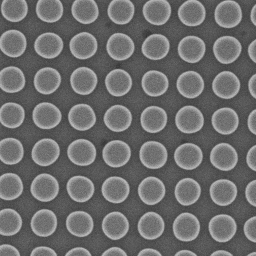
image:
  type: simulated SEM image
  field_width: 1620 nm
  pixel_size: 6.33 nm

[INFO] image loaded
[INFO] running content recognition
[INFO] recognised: an array of small figures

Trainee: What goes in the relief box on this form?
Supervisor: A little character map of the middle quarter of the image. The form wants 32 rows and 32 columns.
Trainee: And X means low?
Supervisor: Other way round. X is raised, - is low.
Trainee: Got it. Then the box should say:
--------------------------------
---XXXX------X------------------
--XXXXXX---XXXXX----XXXXX-----XX
--XXXXXX---XXXXXX---XXXXXX---XXX
--XXXXXX--XXXXXXX---XXXXXX--XXXX
--XXXXXX---XXXXXX---XXXXXX--XXXX
---XXXX----XXXXX----XXXXXX---XXX
----XX------XXX------XXX-----XXX
-------------------------------X
--------------------------------
---XXX------XX-----------------X
--XXXXX----XXXXX----XXXXX----XXX
-XXXXXXX--XXXXXXX--XXXXXXX--XXXX
-XXXXXXX--XXXXXXX--XXXXXXX--XXXX
-XXXXXXX--XXXXXXX--XXXXXXX--XXXX
--XXXXX----XXXXX----XXXXX---XXXX
----X-------XXX-----XXXX-----XXX
--------------------------------
--------------------------------
--XXXX-----XXXX------XX---------
-XXXXXX---XXXXXX----XXXXX----XXX
-XXXXXXX--XXXXXX---XXXXXXX--XXXX
-XXXXXXX--XXXXXX---XXXXXXX--XXXX
-XXXXXXX--XXXXXX---XXXXXXX--XXXX
--XXXXX---XXXXXX---XXXXXX---XXXX
------------XX------XXXXX----XXX
--------------------------------
--------------------------------
--XXXX-----XXX-------XX---------
-XXXXXX---XXXXXX---XXXXX-----XXX
-XXXXXX---XXXXXX---XXXXXX---XXXX
-XXXXXX---XXXXXX---XXXXXX---XXXX